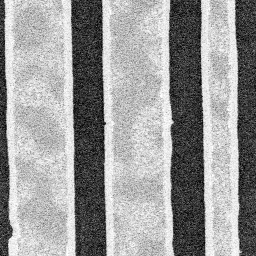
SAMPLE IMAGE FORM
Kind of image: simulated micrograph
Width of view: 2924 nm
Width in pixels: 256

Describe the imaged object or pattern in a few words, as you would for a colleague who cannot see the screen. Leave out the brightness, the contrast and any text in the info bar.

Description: one or a few lines or trenches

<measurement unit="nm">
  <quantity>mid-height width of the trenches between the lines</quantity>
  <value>444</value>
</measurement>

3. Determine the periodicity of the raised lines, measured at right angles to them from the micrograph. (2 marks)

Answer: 1030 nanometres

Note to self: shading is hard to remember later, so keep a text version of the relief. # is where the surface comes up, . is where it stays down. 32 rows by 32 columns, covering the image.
.#######.....########.....###...
.#######.....########.....###...
.#######.....########.....###...
.#######.....########.....###...
.#######.....########.....###...
.#######.....########.....###...
.########....########.....###...
.########....########.....###...
.########....########.....###...
.########....########.....###...
.########....########.....###...
.########....########.....###...
.########....########.....###...
.########....########.....###...
.########.....#######.....###...
.########.....#######.....###...
.########.....#######.....###...
.########.....#######.....###...
.########.....#######.....###...
..#######.....#######.....###...
..#######.....#######.....###...
..#######.....#######.....###...
..#######.....#######.....###...
..#######.....#######.....###...
..#######.....#######.....###...
..#######.....#######.....###...
..#######.....#######.....###...
..#######.....#######.....###...
..#######.....#######.....###...
..#######.....#######.....###...
..#######.....#######.....###...
..#######.....#######.....####..